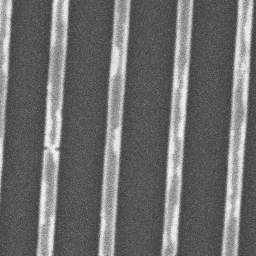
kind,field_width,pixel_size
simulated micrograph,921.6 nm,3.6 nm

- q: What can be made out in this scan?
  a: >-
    parallel lines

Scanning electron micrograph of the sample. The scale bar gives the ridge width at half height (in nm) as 46.7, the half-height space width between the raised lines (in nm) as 170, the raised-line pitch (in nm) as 222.